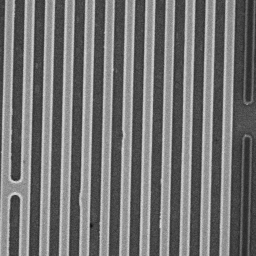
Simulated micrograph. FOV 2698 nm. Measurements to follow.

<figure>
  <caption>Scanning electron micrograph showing parallel lines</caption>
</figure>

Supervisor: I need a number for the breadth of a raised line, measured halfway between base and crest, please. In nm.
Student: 79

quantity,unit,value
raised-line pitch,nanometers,211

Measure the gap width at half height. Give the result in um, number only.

0.128